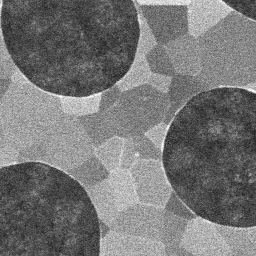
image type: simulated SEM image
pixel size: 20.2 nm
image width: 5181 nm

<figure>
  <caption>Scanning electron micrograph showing holes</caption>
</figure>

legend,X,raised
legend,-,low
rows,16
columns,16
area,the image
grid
---------XXXXX--
---------XXXXXXX
---------XXXXXXX
X-------XXXXXXXX
X-------XXXXXXXX
XX-----XXXXXXX-X
XXXXXXXXXXXX----
XXXXXXXXXXX-----
XXXXXXXXXX------
XXXXXXXXXX------
----XXXXXX------
-----XXXXXX-----
------XXXXX-----
------XXXXXX----
------XXXXXXXXXX
------XXXXXXXXXX